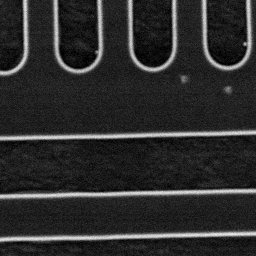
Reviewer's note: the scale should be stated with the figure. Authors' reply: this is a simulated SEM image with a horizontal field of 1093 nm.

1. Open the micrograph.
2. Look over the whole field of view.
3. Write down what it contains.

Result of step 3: groups of lines, slits or small figures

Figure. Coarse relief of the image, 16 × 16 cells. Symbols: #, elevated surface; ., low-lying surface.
..##..##...##...
..##..##...##...
..##..##...##...
..##..##...##..#
################
################
################
################
#########.......
................
................
................
################
################
################
................